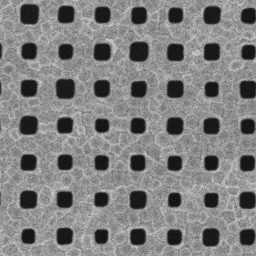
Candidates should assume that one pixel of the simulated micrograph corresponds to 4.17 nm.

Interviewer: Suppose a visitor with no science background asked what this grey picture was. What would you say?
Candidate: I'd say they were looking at a regular array of holes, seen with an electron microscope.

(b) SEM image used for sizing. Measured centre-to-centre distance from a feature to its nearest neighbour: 152 nanometres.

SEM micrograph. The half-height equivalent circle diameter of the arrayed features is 0.0698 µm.